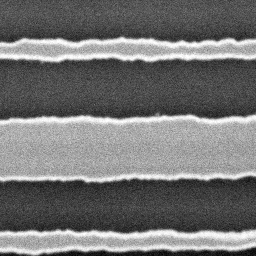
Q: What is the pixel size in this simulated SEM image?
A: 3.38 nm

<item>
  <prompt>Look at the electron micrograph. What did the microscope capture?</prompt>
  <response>lines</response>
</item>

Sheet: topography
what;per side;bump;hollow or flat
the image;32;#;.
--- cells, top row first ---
................................
................................
................................
................................
................................
################################
################################
.....###.......##.##............
................................
................................
................................
................................
................................
................................
.......................#.......#
################################
################################
################################
################################
################################
################################
################################
#..........###..................
................................
................................
................................
................................
................................
................................
################################
################################
#######.........................